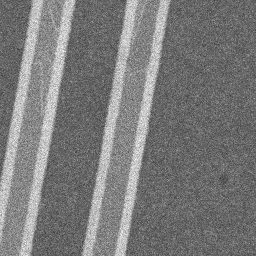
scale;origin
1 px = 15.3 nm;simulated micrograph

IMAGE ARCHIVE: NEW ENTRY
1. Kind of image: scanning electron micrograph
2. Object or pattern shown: one or a few lines or trenches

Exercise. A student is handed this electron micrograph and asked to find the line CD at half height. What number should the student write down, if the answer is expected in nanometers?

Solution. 474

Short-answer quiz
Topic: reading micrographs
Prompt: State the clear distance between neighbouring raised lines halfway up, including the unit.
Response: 949 nanometers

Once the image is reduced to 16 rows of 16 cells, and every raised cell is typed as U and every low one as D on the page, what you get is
DDUUDDDDUUDDDDDD
DDUUDDDDUUDDDDDD
DDUUDDDDUUDDDDDD
DDUUDDDDUUDDDDDD
DDUUDDDDUUDDDDDD
DUUDDDDUUDDDDDDD
DUUDDDDUUDDDDDDD
DUUDDDDUUDDDDDDD
DUUDDDDUUDDDDDDD
DUUDDDDUUDDDDDDD
DUUDDDUUDDDDDDDD
UUDDDDUUDDDDDDDD
UUDDDDUUDDDDDDDD
UUDDDDUUDDDDDDDD
UUDDDDUUDDDDDDDD
UUDDDDUUDDDDDDDD